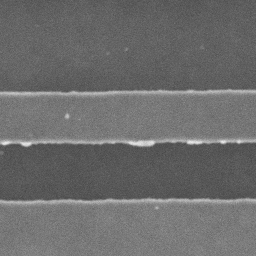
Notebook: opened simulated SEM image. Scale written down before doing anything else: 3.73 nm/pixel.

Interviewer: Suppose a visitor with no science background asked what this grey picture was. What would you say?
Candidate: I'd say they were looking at lines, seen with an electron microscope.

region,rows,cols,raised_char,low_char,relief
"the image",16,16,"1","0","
0000000000000000
0000000000000000
0000000000000000
0000000000000000
0000000000000000
0000000000000000
1111111111111111
1111111111111111
1111111111111111
0000000000000000
0000000000000000
0000000000000000
0000000011111101
1111111111111111
1111111111111111
1111111111111111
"